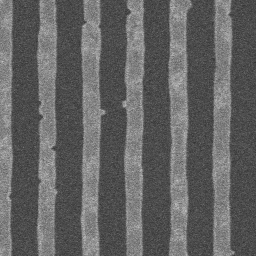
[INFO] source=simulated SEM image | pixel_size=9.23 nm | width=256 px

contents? parallel lines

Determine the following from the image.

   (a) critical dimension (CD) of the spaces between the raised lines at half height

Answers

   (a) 0.265 µm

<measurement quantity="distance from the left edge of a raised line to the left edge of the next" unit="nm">403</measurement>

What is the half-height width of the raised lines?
141 nanometers